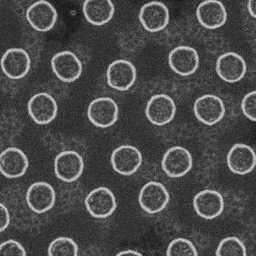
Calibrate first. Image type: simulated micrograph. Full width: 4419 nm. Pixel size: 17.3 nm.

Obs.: a regular array of raised bodies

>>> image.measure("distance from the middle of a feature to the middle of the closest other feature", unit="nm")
828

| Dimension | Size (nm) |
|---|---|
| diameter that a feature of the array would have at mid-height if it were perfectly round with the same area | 470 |